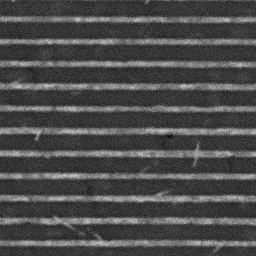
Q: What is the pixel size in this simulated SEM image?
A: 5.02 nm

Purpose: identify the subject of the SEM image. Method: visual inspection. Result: parallel lines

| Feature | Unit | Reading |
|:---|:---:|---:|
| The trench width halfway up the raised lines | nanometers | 86.6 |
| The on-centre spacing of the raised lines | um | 0.112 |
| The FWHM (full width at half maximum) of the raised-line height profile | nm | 23.2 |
